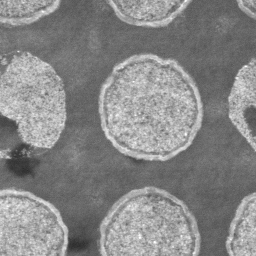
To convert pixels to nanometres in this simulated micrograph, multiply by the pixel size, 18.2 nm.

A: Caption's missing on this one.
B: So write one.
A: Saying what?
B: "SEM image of raised bodies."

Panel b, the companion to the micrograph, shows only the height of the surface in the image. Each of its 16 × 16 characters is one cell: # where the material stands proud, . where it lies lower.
###....####....#
................
................
................
.......####.....
.......#####....
......######....
......######....
.......#####....
........###.....
................
................
##......###.....
####...#####...#
####..######...#
####..######..##